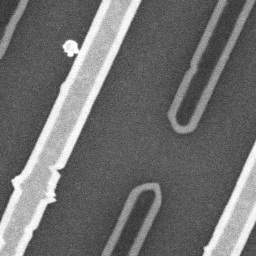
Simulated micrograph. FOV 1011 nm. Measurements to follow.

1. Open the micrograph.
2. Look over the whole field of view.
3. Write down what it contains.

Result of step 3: one or a few lines or trenches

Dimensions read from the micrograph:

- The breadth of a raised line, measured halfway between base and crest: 102 nanometres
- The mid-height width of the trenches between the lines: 0.308 microns